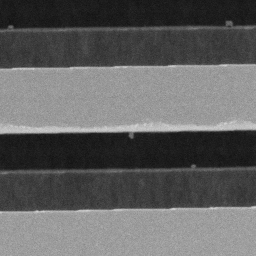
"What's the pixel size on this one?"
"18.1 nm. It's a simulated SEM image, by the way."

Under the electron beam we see lines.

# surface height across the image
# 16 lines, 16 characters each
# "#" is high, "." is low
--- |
................
................
################
################
################
################
################
################
................
................
................
################
################
################
################
################